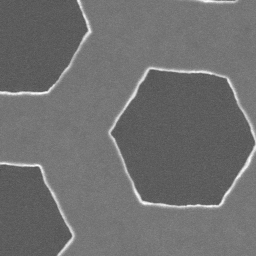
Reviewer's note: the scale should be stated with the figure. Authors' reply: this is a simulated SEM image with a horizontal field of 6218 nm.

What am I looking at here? holes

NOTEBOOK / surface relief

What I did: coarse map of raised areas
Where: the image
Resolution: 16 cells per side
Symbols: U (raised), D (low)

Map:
DDDDDUUUUUUUUUUU
DDDDDUUUUUUUUUUU
DDDDDUUUUUUUUUUU
DDDDDUUUUUUUUUUU
DDDDUUUUUDDUUUUU
DDDUUUUUUDDDDDUU
UUUUUUUUDDDDDDDU
UUUUUUUDDDDDDDDU
UUUUUUUDDDDDDDDD
UUUUUUUUDDDDDDDD
DDUUUUUUDDDDDDDU
DDDUUUUUDDDDDDDU
DDDUUUUUUDDDDDUU
DDDDUUUUUUUUUUUU
DDDDUUUUUUUUUUUU
DDDDUUUUUUUUUUUU